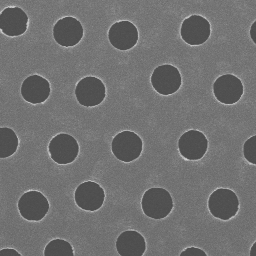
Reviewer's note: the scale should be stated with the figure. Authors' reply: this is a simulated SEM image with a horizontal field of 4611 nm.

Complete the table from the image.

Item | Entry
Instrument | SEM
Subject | a regular array of holes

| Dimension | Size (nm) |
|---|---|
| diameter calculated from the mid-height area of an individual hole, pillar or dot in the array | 538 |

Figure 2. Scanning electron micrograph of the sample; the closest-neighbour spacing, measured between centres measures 57.3 px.